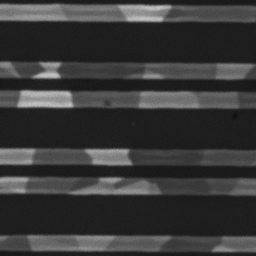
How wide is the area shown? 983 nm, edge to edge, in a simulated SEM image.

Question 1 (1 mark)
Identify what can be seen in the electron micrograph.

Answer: wiring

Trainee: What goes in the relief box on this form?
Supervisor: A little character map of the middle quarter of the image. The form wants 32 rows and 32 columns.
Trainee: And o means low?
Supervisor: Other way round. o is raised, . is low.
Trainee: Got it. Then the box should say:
oooooooooooooooooooooooooooooooo
oooooooooooooooooo.....ooooooooo
oooooooooooooooooo.....ooooooooo
........ooooo.oooooooooooooooooo
................................
................................
................................
oooooooooooooooooooooooooooooooo
oooooooooooooooooooooooooooooooo
oooooooooooooooooooooooooooooooo
oooooooooooooooooooooooooooooooo
................................
................................
................................
................................
................................
................................
................................
................................
................................
................................
oo..............................
oooooooooooooooooooooooooooooooo
oooooooooooooooooooooooooooooooo
oooooooooooooooooooooooooooooooo
................................
................................
................................
................................
oooooooooooooooooooooooooooooooo
oooooooooooooooooooooooooooooooo
oooooooooooooooooooooooooooooooo